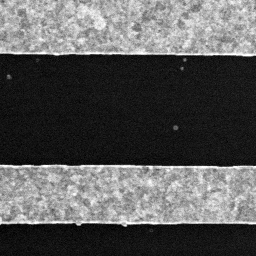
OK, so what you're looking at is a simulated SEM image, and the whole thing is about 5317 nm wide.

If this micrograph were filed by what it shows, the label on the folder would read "wiring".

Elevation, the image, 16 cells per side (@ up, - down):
@@@@@@@@@@@@@@@@
@@@@@@@@@@@@@@@@
@@@@@@@@@@@@@@@@
----------------
----------------
----------------
----------------
----------------
----------------
----------------
@@@@@@@@@@@@@@@@
@@@@@@@@@@@@@@@@
@@@@@@@@@@@@@@@@
@@@@@@@@@@@@@@@@
----------------
----------------